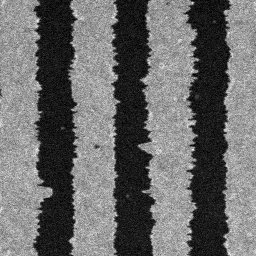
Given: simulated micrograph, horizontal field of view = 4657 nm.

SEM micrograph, one or a few lines or trenches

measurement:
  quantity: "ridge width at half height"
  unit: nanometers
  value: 650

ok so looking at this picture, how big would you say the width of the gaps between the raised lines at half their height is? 674 nm